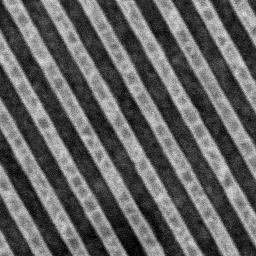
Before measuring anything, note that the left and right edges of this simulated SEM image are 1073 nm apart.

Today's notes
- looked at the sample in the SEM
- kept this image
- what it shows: parallel lines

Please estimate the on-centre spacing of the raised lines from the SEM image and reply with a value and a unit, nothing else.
137 nm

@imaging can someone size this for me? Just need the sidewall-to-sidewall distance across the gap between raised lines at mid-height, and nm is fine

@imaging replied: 87.4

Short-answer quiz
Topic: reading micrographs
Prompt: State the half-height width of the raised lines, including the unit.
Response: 12.4 px